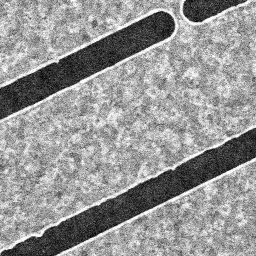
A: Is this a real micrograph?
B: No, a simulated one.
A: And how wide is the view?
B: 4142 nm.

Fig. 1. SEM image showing one or a few lines or trenches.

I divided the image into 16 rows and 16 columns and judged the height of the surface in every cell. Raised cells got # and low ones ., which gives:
###########....#
########...#####
######....######
####....########
##....##########
....############
..##############
################
###############.
#############...
###########....#
#########....###
######.....#####
####.....#######
###....#########
.....###########